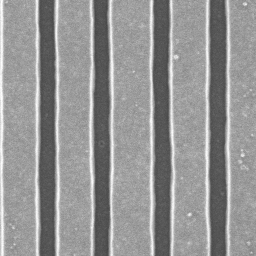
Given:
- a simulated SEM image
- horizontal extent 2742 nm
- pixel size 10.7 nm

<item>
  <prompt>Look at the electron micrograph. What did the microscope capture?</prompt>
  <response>parallel lines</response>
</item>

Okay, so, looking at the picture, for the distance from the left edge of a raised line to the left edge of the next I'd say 613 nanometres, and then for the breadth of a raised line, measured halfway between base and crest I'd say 411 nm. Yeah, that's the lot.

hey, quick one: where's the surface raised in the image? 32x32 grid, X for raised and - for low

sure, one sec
XXXXX--XXXXX--XXXXX--XXXXX--XXXX
XXXXX--XXXXX--XXXXX--XXXXX--XXXX
XXXXX--XXXXX--XXXXX--XXXXX--XXXX
XXXXX--XXXXX--XXXXX--XXXXX--XXXX
XXXXX--XXXXX--XXXXX--XXXXX--XXXX
XXXXX--XXXXX--XXXXX--XXXXX--XXXX
XXXXX--XXXXX--XXXXX--XXXXX--XXXX
XXXXX--XXXXX--XXXXX--XXXXX--XXXX
XXXXX--XXXXX--XXXXX--XXXXX--XXXX
XXXXX--XXXXX--XXXXX--XXXXX--XXXX
XXXXX--XXXXX--XXXXX--XXXXX--XXXX
XXXXX--XXXXX--XXXXX--XXXXX--XXXX
XXXXX--XXXXX--XXXXX--XXXXX--XXXX
XXXXX--XXXXX--XXXXX--XXXXX--XXXX
XXXXX--XXXXX--XXXXX--XXXXX--XXXX
XXXXX--XXXXX--XXXXX--XXXXX--XXXX
XXXXX--XXXXX--XXXXX--XXXXX--XXXX
XXXXX--XXXXX--XXXXX--XXXXX--XXXX
XXXXX--XXXXX--XXXXX--XXXXX--XXXX
XXXXX--XXXXX--XXXXX--XXXXX--XXXX
XXXXX--XXXXX--XXXXX--XXXXX--XXXX
XXXXX--XXXXX--XXXXX---XXXX--XXXX
XXXXX--XXXXX--XXXXX---XXXX--XXXX
XXXXX--XXXXX--XXXXX---XXXX---XXX
XXXXX--XXXXX--XXXXX---XXXX---XXX
XXXXX--XXXXX--XXXXX--XXXXX---XXX
XXXXX--XXXXX--XXXXX--XXXXX---XXX
XXXXX--XXXXX--XXXXX--XXXXX--XXXX
XXXXX--XXXXX--XXXXX--XXXXX--XXXX
XXXXX--XXXXX--XXXXX--XXXXX--XXXX
XXXXX--XXXXX--XXXXX--XXXXX--XXXX
XXXXX--XXXXX--XXXXX--XXXXX--XXXX